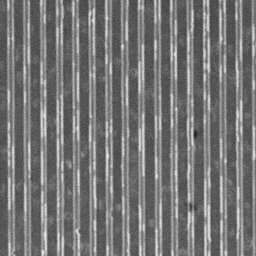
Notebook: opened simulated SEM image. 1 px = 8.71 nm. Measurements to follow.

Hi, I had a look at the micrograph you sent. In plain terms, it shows parallel lines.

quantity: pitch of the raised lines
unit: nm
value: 142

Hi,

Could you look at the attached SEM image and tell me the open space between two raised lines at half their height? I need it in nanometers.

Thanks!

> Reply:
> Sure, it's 94.7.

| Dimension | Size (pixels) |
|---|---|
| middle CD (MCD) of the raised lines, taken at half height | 5.88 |